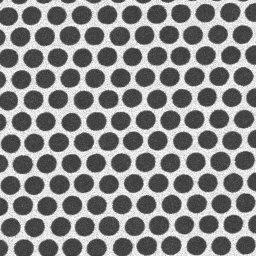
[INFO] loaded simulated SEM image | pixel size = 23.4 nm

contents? a regular array of holes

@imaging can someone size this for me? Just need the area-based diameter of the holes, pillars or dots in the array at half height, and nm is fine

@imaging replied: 468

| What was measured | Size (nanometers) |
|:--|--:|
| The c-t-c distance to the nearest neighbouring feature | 557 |